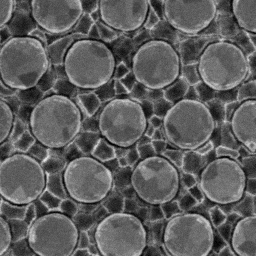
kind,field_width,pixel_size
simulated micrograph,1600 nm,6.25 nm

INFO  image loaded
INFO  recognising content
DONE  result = a regular array of raised bodies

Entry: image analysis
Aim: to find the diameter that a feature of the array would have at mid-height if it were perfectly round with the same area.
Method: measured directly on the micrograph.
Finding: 291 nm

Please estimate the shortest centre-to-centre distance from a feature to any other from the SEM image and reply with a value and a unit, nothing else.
0.417 µm